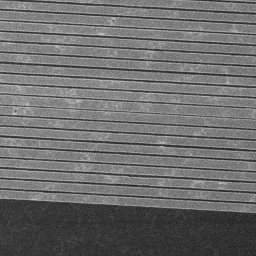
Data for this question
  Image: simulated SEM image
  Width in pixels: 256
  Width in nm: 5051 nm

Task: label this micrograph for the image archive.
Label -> parallel lines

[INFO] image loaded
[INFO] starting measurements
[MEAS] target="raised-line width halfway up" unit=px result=7.99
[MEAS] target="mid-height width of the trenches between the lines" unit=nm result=49.2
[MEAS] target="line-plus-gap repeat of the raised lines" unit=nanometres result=208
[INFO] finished